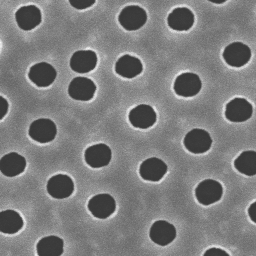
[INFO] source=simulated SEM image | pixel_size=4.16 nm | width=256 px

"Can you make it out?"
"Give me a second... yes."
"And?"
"a regular array of holes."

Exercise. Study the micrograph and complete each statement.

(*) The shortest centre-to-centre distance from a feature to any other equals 213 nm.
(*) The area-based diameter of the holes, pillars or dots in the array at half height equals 109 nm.